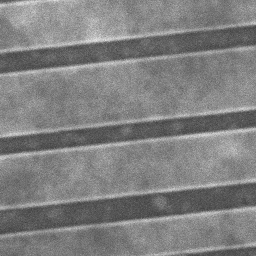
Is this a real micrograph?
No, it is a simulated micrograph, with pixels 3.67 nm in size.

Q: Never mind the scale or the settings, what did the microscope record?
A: one or a few lines or trenches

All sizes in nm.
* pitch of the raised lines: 278